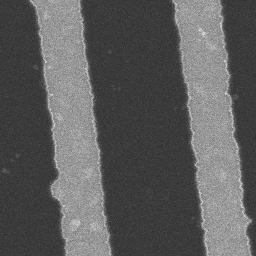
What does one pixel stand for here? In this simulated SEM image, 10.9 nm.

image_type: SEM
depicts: one or a few lines or trenches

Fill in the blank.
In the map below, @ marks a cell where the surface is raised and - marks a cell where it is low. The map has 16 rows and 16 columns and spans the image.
@@---@@@@@@---@@
@@---@@@@@@---@@
@@@--@@@@@@---@@
@@@--@@@@@@---@@
@@@--@@@@@@@--@@
@@@---@@@@@@--@@
@@@---@@@@@@--@@
@@@---@@@@@@--@@
@@@---@@@@@@---@
@@@---@@@@@@---@
@@@@--@@@@@@---@
@@@---@@@@@@---@
@@@@--@@@@@@@--@
@@@@--@@@@@@@--@
@@@@---@@@@@@--@
@@@@---@@@@@@---